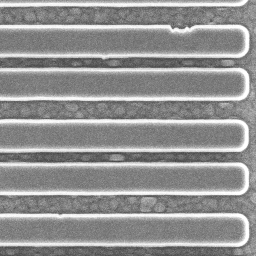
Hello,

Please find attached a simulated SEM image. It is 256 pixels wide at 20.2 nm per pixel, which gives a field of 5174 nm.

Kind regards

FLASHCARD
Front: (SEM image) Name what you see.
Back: parallel lines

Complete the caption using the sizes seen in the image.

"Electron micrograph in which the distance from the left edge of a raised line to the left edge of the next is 47.2 px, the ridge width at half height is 596 nanometres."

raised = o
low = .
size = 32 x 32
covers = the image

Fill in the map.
oooooooooooooooooooooooooooooo..
................................
................................
ooooooooooooooooooooo...oooooo..
ooooooooooooooooooooooooooooooo.
ooooooooooooooooooooooooooooooo.
ooooooooooooooooooooooooooooooo.
................................
................................
ooooooooooooooooooooooooooooooo.
ooooooooooooooooooooooooooooooo.
ooooooooooooooooooooooooooooooo.
................................
................................
................................
oooooooooooooooooooooooooooooo..
ooooooooooooooooooooooooooooooo.
ooooooooooooooooooooooooooooooo.
oooooooooooooooooooooooooooooo..
................................
............oo.ooo.......o......
ooooooooooooooooooooooooooooooo.
ooooooooooooooooooooooooooooooo.
ooooooooooooooooooooooooooooooo.
................................
................................
................................
ooooooooooooooooooooooooooooooo.
ooooooooooooooooooooooooooooooo.
ooooooooooooooooooooooooooooooo.
oooooooooooooooooooooooooooooo..
................................